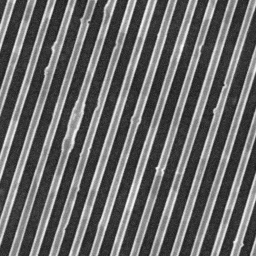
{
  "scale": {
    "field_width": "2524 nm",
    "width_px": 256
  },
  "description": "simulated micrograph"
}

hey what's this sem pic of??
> parallel lines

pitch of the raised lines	190	nanometres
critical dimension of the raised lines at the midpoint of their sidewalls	0.0624	um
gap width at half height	124	nanometres